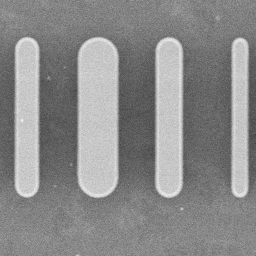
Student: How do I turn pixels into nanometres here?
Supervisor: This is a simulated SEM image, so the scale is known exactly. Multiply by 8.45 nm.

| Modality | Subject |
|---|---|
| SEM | groups of lines, slits or small figures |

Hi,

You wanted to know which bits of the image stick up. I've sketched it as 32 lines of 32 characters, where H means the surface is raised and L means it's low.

LLLLLLLLLLLLLLLLLLLLLLLLLLLLLLLL
LLLLLLLLLLLLLLLLLLLLLLLLLLLLLLLL
LLLLLLLLLLLLLLLLLLLLLLLLLLLLLLLL
LLLLLLLLLLLLLLLLLLLLLLLLLLLLLLLL
LLLLLLLLLLLLLLLLLLLLLLLLLLLLLLLL
LLHHLLLLLLLHHHLLLLLLHHLLLLLLLHHL
LLHHHLLLLLHHHHHLLLLLHHHLLLLLLHHL
LLHHHLLLLLHHHHHLLLLLHHHLLLLLLHHL
LLHHHLLLLLHHHHHLLLLLHHHLLLLLLHHL
LLHHHLLLLLHHHHHLLLLLHHHLLLLLLHHL
LLHHHLLLLLHHHHHLLLLLHHHLLLLLLHHL
LLHHHLLLLLHHHHHLLLLLHHHLLLLLLHHL
LLHHHLLLLLHHHHHLLLLLHHHLLLLLLHHL
LLHHHLLLLLHHHHHLLLLLHHHLLLLLLHHL
LLHHHLLLLLHHHHHLLLLLHHHLLLLLLHHL
LLHHHLLLLLHHHHHLLLLLHHHLLLLLLHHL
LLHHHLLLLLHHHHHLLLLLHHHLLLLLLHHL
LLHHHLLLLLHHHHHLLLLLHHHLLLLLLHHL
LLHHHLLLLLHHHHHLLLLLHHHLLLLLLHHL
LLHHHLLLLLHHHHHLLLLLHHHLLLLLLHHL
LLHHHLLLLLHHHHHLLLLLHHHLLLLLLHHL
LLHHHLLLLLHHHHHLLLLLHHHLLLLLLHHL
LLHHHLLLLLHHHHHLLLLLHHHLLLLLLHHL
LLHHHLLLLLHHHHLLLLLLHHHLLLLLLHHL
LLLLLLLLLLLLLLLLLLLLLLLLLLLLLLLL
LLLLLLLLLLLLLLLLLLLLLLLLLLLLLLLL
LLLLLLLLLLLLLLLLLLLLLLLLLLLLLLLL
LLLLLLLLLLLLLLLLLLLLLLLLLLLLLLLL
LLLLLLLLLLLLLLLLLLLLLLLLLLLLLLLL
LLLLLLLLLLLLLLLLLLLLLLLLLLLLLLLL
LLLLLLLLLLLLLLLLLLLLLLLLLLLLLLLL
LLLLLLLLLLLLLLLLLLLLLLLLLLLLLLLL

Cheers